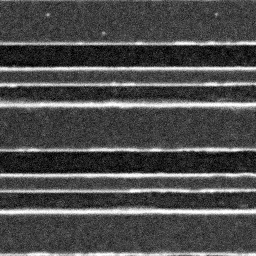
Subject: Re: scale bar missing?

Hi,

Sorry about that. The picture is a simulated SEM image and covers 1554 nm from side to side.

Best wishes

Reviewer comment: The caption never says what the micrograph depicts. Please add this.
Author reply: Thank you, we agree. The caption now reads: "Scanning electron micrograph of lines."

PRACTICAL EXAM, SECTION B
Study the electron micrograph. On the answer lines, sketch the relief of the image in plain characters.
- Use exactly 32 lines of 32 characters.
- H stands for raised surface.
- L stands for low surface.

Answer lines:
HHHHHHHHHHHHHHHHHHHHHHHHHHHHHHHH
HHHHHHHHHHHHHHHHHHHHHHHHHHHHHHHH
HHHHHHHHHHHHHHHHHHHHHHHHHHHHHHHH
HHHHHHHHHHHHHHHHHHHHHHHHHHHHHHHH
HHHHHHHHHHHHHHHHHHHHHHHHHHHHHHHH
HHHHHHHHHHHHHHHHHHHHHHHLHHHHHHLH
LLLLLLLLLLLLLLLLLLLLLLLLLLLLLLLL
LLLLLLLLLLLLLLLLLLLLLLLLLLLLLLLL
LLLLLLLLLLLLLLLLLLLLLLLLLHHLLHHH
HHHHHHHHHHHHHHHHHHHHHHHHHHHHHHHH
HHHHHHHHHHHHHHHHHHHHHHHHHHHHHHHH
LLLLLLLLLLLLLLLLLLLLLLLLLLLLLLLL
LLLLLLLLLLLLLLLLLLLLLLLLLLLLLLLL
HHHHHHHHHHHHHHHHHHHHHHHHHHHHHHHH
HHHHHHHHHHHHHHHHHHHHHHHHHHHHHHHH
HHHHHHHHHHHHHHHHHHHHHHHHHHHHHHHH
HHHHHHHHHHHHHHHHHHHHHHHHHHHHHHHH
HHHHHHHHHHHHHHHHHHHHHHHHHHHHHHHH
HHHHHHHHHHHHHHHHHHHHHHHHHHHHHHHH
LLLLLLLLLLLLLLLLLLLLLLLLLLLLLLLL
LLLLLLLLLLLLLLLLLLLLLLLLLLLLLLLL
LLLLLLLLLLLLLLLLLLLLLLLLLLLLLLLL
HHHHHHHHHHHHHHHHHHHHHHHHHHHHHHHH
HHHHHHHHHHHHHHHHHHHHHHHHHHHHHHHH
LLLLLLLLLLLLLLLLLLLLLLLLLLLLLLLL
LLLLLLLLLLLLLLLLLLLLLLLLLLLLLLLL
HHHHHHHHHHHHHHHHHHHHHHHHHHHHHHHH
HHHHHHHHHHHHHHHHHHHHHHHHHHHHHHHH
HHHHHHHHHHHHHHHHHHHHHHHHHHHHHHHH
HHHHHHHHHHHHHHHHHHHHHHHHHHHHHHHH
HHHHHHHHHHHHHHHHHHHHHHHHHHHHHHHH
HHHHHHHHHHHHHHHHHHHHHHHHHHHHHHHH